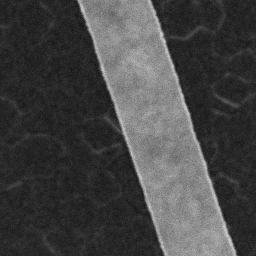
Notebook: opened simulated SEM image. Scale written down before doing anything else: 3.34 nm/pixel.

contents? one or a few lines or trenches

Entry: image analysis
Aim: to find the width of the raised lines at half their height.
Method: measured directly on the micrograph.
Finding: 222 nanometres